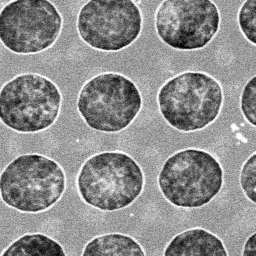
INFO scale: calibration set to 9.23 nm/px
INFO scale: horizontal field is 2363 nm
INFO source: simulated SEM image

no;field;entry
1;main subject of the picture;holes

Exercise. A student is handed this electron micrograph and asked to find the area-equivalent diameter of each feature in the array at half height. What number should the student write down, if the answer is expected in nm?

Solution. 556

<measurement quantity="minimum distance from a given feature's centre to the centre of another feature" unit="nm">719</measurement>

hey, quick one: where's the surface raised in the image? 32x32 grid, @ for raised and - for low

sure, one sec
@-----@@@@@------@@@-------@@@@-
-------@@@-------@@@-------@@@--
--------@@--------@--------@@@--
--------@@--------@@-------@@@--
-------@@@-------@@@-------@@@@-
@-----@@@@@-----@@@@@-----@@@@@@
@@--@@@@@@@@@@@@@@@@@@@@@@@@@@@@
@@@@@@@@@@@@@@@@@@@@@@@@@@@@@@@@
@@@@@@@@@@@@@@@@@@@@@@@@@@@@@@@@
@@---@@@@@@@---@@@@@@@----@@@@@@
@------@@@@------@@@@------@@@@-
-------@@@-------@@@--------@@--
--------@@--------@@--------@@--
-------@@@-------@@@-------@@@--
-------@@@-------@@@-------@@@@-
@-----@@@@@-----@@@@@-----@@@@@@
@@@-@@@@@@@@@@@@@@@@@@@@@@@@@@@@
@@@@@@@@@@@@@@@@@@@@@@@@@@@@@@@@
@@@@@@@@@@@@@@@@@@@@@@@@@@@@@@@@
@@@--@@@@@@@----@@@@@@----@@@@@@
@------@@@@------@@@@------@@@@-
--------@@--------@@--------@@--
--------@@--------@@--------@@--
--------@@--------@@--------@@--
--------@@-------@@@@------@@@@-
@------@@@@-----@@@@@@----@@@@@@
@@@@@@@@@@@@@@@@@@@@@@@@@@@@@@@@
@@@@@@@@@@@@@@@@@@@@@@@@@@@@@@@@
@@@@@@@@@@@@@@@@@@@@@@@@@@@@@@@@
@@@---@@@@@@@---@@@@@@-----@@@@-
@@-----@@@@------@@@@-------@@@-
@-------@@--------@@@-------@@--